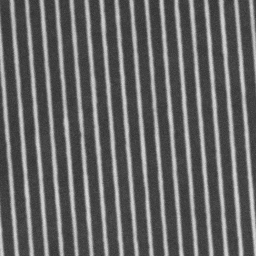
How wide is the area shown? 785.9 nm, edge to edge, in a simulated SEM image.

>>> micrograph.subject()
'parallel lines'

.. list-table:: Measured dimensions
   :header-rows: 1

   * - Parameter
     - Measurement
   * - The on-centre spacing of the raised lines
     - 45.8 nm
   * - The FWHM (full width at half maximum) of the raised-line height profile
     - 11.9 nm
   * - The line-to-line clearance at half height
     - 0.0356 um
